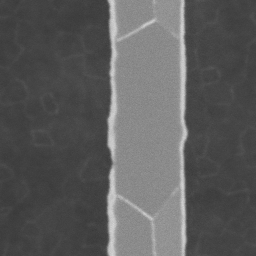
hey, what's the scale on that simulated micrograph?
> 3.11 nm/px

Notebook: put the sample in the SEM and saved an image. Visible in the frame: one or a few lines or trenches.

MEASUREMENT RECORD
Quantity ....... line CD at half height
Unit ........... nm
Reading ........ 221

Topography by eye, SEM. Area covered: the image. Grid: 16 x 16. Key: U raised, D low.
DDDDDDDUUUUDDDDD
DDDDDDDUUUUDDDDD
DDDDDDDUUUUDDDDD
DDDDDDDUUUUDDDDD
DDDDDDDUUUUDDDDD
DDDDDDDUUUUDDDDD
DDDDDDDUUUUDDDDD
DDDDDDDUUUUDDDDD
DDDDDDDUUUUUDDDD
DDDDDDDUUUUDDDDD
DDDDDDDUUUUDDDDD
DDDDDDDUUUUDDDDD
DDDDDDDUUUUDDDDD
DDDDDDDUUUUDDDDD
DDDDDDDUUUUUDDDD
DDDDDDDUUUUDDDDD